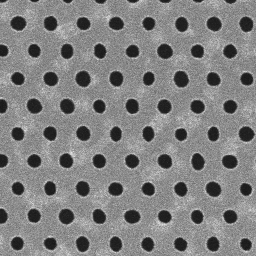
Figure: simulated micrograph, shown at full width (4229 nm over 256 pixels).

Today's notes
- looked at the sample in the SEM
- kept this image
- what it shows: a regular array of holes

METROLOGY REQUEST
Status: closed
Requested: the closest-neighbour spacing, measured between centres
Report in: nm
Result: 524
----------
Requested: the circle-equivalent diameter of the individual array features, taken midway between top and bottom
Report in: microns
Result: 0.236